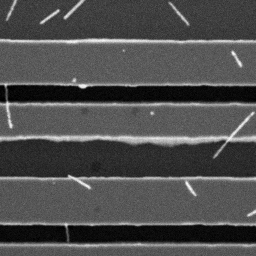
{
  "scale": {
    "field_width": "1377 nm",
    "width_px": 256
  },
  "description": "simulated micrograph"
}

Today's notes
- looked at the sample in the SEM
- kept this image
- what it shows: lines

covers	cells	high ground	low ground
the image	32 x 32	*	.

................................
................................
................................
................................
................................
********************************
********************************
********************************
********************************
********************************
********************************
................................
................................
********************************
********************************
********************************
********************************
................................
................................
................................
................................
................................
********************************
********************************
********************************
********************************
********************************
********************************
................................
................................
**.*.***......*****.**..........
********************************